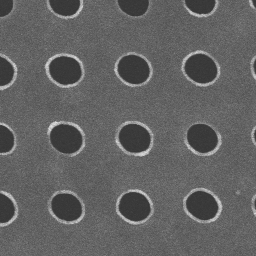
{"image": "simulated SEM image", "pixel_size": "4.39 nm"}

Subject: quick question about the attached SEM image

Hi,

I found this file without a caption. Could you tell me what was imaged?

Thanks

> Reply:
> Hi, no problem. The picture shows a regular array of holes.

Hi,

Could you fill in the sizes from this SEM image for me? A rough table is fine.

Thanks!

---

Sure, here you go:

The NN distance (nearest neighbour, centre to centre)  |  297 nm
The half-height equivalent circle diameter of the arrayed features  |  132 nm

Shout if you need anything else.